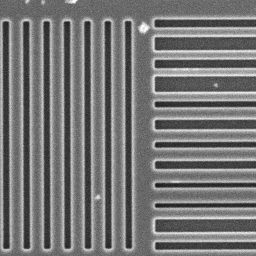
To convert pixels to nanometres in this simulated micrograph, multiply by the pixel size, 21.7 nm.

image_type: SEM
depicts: groups of lines, slits or small figures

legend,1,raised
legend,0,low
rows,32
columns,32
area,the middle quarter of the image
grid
00111001110011100111111000000000
00111001110011100111111111111111
00111001110011100111111111111111
00111001110011100111111000000000
00111001110011100111111000000000
00111001110011100111111000000000
00111001110011100111111000000000
00111001110011100111111111111111
00111001110011100111111111111111
00111001110011100111111000000000
00111001110011100111111000000000
00111001110011100111111111111111
00111001110011100111111111111111
00111001110011100111111111111111
00111001110011100111111000000000
00111001110011100111111000000000
00111001110011100111111000000000
00111001110011100111111111111111
00111001110011100111111111111111
00111001110011100111111000000000
00111001110011100111111000000000
00111001110011100111111111111111
00111001110011100111111111111111
00111001110011100111111111111111
00111001110011100111111000000000
00111001110011100111111000000000
00111001110011100111111000000000
00111001110011100111111111111111
00111001110011100111111111111111
00111001110011100111111000000000
00111001110011100111111000000000
00111001110011100111111111111111